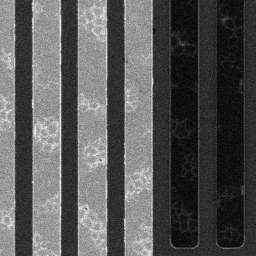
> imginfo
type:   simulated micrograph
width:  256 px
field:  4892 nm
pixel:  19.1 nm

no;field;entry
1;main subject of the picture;parallel lines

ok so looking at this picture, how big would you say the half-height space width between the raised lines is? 337 nanometres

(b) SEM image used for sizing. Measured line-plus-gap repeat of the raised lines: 878 nm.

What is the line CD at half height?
0.542 µm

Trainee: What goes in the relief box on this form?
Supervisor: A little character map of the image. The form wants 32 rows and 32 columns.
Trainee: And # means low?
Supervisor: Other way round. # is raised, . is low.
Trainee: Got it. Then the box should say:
##..###...###...###..####..###..
##..###...###...###..####..###..
##..###...###...###..####..#.#..
##..###...###...###..####..###..
##..###...###...###...###..###..
##..###...###...###..#.##..###..
##..###...###...###..####..####.
##..###...###...###..####..####.
##..###...###...###..####..####.
##..###...###...###..####..####.
##..###...###...###..####..###..
##..###...###...###..####..####.
##..###...###...###..####..####.
##..###...###...###..####..####.
##..###...###...###..####..####.
##..###...###...###..####..####.
##..###...###...###..####..####.
##..###...###...###..####..####.
##..###...###...###..####..####.
##..###...##....###..####..####.
##..###...###...###..####..####.
##..###...###...###..####..####.
##..###...###...###..####..####.
##..###...###...###..####..####.
##..###...###...###..####..####.
##..###...###...###..####..####.
##..###...###...###..####..####.
##..###...###...###..####..####.
##..###...###...###..####..####.
##..###...###...###..####..####.
##..###...###...###..####..###..
##..###...###...###.............